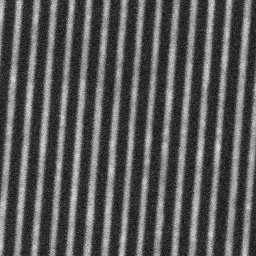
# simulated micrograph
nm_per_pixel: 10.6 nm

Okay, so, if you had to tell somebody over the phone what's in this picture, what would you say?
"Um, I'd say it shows parallel lines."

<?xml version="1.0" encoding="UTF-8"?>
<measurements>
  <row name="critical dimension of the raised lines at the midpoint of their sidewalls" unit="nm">50.1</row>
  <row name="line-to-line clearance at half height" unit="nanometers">128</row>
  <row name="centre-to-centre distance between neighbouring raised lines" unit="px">17.5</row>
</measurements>